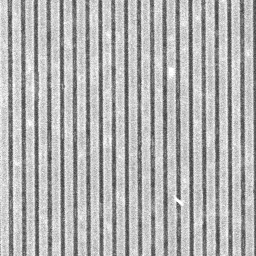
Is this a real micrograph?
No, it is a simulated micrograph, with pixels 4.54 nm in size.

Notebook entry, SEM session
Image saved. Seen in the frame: parallel lines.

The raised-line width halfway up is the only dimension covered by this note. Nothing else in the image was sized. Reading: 8.48 px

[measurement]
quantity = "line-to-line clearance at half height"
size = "0.0215 um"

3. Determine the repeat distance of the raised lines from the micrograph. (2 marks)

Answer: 12.9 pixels